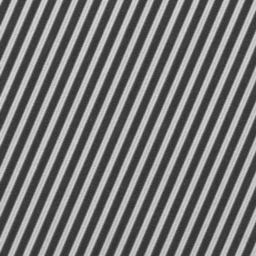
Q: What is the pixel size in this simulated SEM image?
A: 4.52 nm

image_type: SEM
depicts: parallel lines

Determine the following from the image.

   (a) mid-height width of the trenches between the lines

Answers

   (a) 40.5 nm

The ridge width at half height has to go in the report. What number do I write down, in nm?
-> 20.2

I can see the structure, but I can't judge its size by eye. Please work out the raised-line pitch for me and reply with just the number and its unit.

62.9 nm